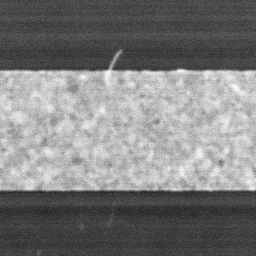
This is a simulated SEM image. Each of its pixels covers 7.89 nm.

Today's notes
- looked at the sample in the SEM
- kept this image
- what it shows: one or a few lines or trenches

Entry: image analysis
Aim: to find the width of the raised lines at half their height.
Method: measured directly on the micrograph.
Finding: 0.932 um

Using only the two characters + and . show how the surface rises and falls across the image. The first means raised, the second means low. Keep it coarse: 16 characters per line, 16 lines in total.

................
................
................
................
....+.++...+.+..
++++++++++++++++
++++++++++++++++
++++++++++++++++
++++++++++++++++
++++++++++++++++
++++++++++++++++
++++++++++++++++
................
................
................
................